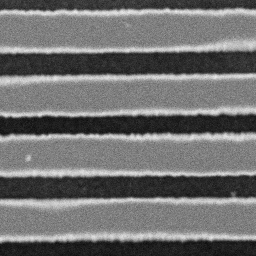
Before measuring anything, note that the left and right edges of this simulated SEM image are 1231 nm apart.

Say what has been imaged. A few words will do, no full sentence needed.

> lines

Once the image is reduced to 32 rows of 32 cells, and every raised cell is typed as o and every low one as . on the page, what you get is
................................
oooooooooooooooooooooooooooooooo
oooooooooooooooooooooooooooooooo
oooooooooooooooooooooooooooooooo
oooooooooooooooooooooooooooooooo
oooooooooooooooooooooooooooooooo
oooooooooooooooooooo....o.......
................................
................................
....oooooooooooooooooooooooooooo
oooooooooooooooooooooooooooooooo
oooooooooooooooooooooooooooooooo
oooooooooooooooooooooooooooooooo
oooooooooooooooooooooooooooooooo
ooooo...ooooo...................
................................
................................
oooooooooooooooooooooooooooooooo
oooooooooooooooooooooooooooooooo
oooooooooooooooooooooooooooooooo
oooooooooooooooooooooooooooooooo
oooooooooooooooooooooooooooooooo
................................
................................
................................
oooooooooooooooooooooooooooooooo
oooooooooooooooooooooooooooooooo
oooooooooooooooooooooooooooooooo
oooooooooooooooooooooooooooooooo
oooooooooooooooooooooooooooooooo
................................
................................